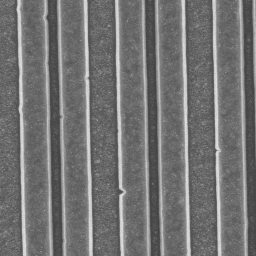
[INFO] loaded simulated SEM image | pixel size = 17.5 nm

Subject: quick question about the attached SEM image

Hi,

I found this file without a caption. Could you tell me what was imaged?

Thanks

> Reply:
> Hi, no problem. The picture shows parallel lines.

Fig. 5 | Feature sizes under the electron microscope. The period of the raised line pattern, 853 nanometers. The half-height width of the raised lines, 490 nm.